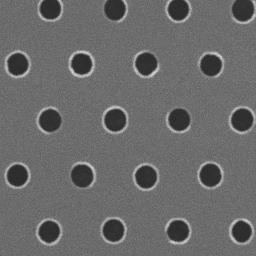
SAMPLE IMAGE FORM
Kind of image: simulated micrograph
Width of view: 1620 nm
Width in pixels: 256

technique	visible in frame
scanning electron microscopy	a regular array of holes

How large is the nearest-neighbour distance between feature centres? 403 nm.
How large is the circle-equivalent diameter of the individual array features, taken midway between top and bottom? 140 nm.